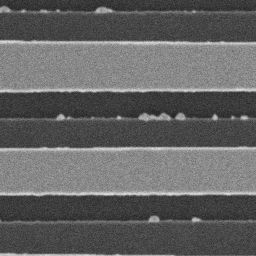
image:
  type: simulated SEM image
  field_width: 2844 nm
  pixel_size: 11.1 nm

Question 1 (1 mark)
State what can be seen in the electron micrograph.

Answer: lines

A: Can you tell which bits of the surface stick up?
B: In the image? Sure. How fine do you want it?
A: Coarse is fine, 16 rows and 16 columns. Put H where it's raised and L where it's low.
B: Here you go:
LLLLLLLLLLLLLLLL
LLLLLLLLLLLLLLLL
LLLLLLLLLLLLLLLL
HHHHHHHHHHHHHHHH
HHHHHHHHHHHHHHHH
HHHHHHHHHHHHHHHH
LLLLLLLLLLLLLLLL
LLLLLLLLLLLLLLLL
LLLLLLLLLLLLLLLL
HHHHHHHHHHHHHHHH
HHHHHHHHHHHHHHHH
HHHHHHHHHHHHHHHH
LLLLLLLLLLLLLLLL
LLLLLLLLLLLLLLLL
LLLLLLLLLLLLLLLL
LLLLLLLLLLLLLLLL